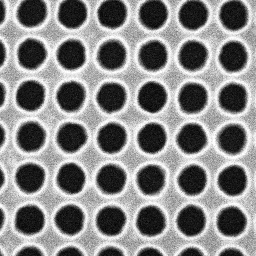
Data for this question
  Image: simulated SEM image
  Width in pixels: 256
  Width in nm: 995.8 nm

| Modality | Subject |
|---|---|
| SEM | a regular array of holes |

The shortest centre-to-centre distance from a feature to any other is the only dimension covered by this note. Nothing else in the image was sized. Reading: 156 nm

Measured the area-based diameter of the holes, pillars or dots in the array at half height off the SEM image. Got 119 nm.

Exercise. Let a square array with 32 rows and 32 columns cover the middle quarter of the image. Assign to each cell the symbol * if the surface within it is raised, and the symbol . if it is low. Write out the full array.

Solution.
.....****......****......****...
*..*******...*******....*******.
********************************
********************************
*..********..********..********.
.....****......****......*****..
.....****......****......****...
.....***........***.......***...
.....***........**........***...
.....***........**........***...
.....****......****......****...
....******....******....*****...
*******************************.
********************************
********************************
.....*****.....*****.....*****..
.....****......****......****...
......***.......**........**....
......**........**........**....
......**........**.......***....
.....****......****......***....
...******.....*****.....*****...
***********.*******************.
********************************
*.******************************
....******...********...*******.
.....****......****......*****..
.....***........**.......****...
.....***........**.......***....
.....***........**.......***....
.....***.......***.......****...
.....****......****.....*****...